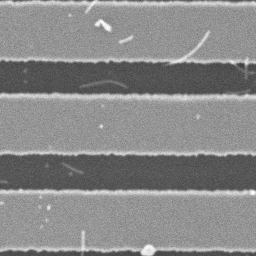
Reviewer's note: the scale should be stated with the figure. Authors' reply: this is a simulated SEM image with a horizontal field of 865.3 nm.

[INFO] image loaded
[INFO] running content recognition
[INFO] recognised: lines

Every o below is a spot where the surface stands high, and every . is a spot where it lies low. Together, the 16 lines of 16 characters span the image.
oooooooooooooooo
oooooooooooooooo
oooooooooooooooo
oooooooooooooooo
................
................
oooooooooooooooo
oooooooooooooooo
oooooooooooooooo
oooooooooooooooo
................
................
oooooooooooooooo
oooooooooooooooo
oooooooooooooooo
oooooooooooooooo